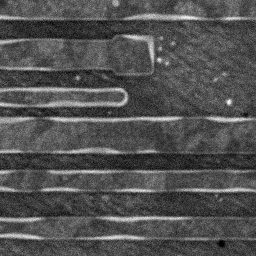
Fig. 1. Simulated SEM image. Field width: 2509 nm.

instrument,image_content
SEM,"groups of lines, slits or small figures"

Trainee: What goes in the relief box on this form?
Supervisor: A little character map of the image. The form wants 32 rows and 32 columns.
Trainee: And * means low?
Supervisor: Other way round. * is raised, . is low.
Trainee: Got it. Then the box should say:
********************************
********************************
................................
................................
................................
*******************.............
*******************.............
*******************.............
*******************.............
................................
................................
****************................
****************................
................................
................................
********************************
********************************
********************************
********************************
................................
................................
*******..***********************
********************************
********************************
................................
................................
................................
*...****************************
********************************
********************************
................................
................................